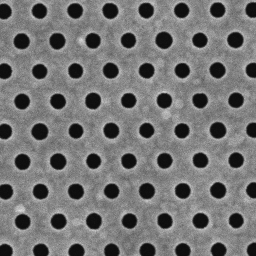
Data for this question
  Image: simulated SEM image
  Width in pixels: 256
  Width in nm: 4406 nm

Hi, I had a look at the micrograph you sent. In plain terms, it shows a regular array of holes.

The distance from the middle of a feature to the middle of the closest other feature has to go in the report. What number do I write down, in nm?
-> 596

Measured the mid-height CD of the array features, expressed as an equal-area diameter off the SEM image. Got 281 nanometres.